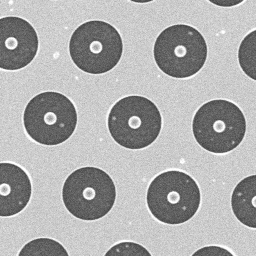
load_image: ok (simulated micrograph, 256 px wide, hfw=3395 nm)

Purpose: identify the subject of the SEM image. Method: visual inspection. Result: an array of small figures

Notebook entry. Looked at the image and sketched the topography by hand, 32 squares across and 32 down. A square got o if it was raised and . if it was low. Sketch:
ooooooooooooooooooooooooooo...oo
oooooooooooooooooooooooooooooooo
...ooooooooooooooooooooooooooooo
....oooooo....ooooooo...oooooooo
.....oooo......ooooo.....oooooo.
.o...oooo...o..oooo.......oooo..
.....oooo......oooo...o...oooo..
....ooooo......oooo.......oooo..
...ooooooo....oooooo.....ooooo..
ooooooooooooooooooooo...ooooooo.
oooooooooooooooooooooooooooooooo
oooooo.ooooooooooooooooooooooooo
oooo.....oooooo....oooooooo.oooo
ooo......ooooo......ooooo.....oo
ooo...o...oooo......oooo.......o
ooo.......ooo...o...oooo...o...o
ooo......ooooo......oooo.......o
oooo....oooooo.....ooooo......oo
oooooooooooooooo..ooooooo....ooo
oooooooooooooooooooooooooooooooo
..oooooooooooooooooooooooooooooo
...oooooo....ooooooo...ooooooooo
....oooo......ooooo.....oooooo..
o...oooo......ooooo......oooo...
....oooo...o...ooo...o...oooo...
...ooooo......oooo.......oooo...
..ooooooo.....ooooo......oooo...
ooooooooooo.oooooooo....oooooo..
oooooooooooooooooooooooooooooooo
oooooooooooooooooooooooooooooooo
ooo.....oooooo...ooooooooooooooo
oo......ooooo......ooooo.....ooo